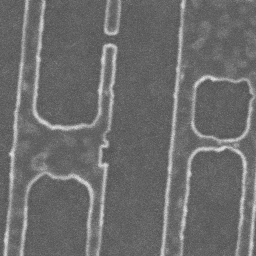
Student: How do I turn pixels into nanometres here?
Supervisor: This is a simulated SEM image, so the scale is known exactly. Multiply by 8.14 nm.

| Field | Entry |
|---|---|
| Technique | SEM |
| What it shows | one or a few lines or trenches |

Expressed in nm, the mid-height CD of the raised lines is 153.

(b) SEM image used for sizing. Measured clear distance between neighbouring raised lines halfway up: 502 nm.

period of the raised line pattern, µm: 0.635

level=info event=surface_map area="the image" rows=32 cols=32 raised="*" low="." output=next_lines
...***.......**........*********
...**........**........*********
...**........**........*********
...**........**........*********
...**.................**********
...**.................**********
...**........**.......**********
...**........*........**********
...**........*........**********
..***........*........**********
..***.......**........***......*
..***.......**........**.......*
..**........**........**.......*
..**........**........**.......*
..***.......**........**.......*
..****.....***........**.......*
..***********.........***......*
..***********........***********
..***********........***********
.************........***......**
.************........***......**
.************........***......**
.***......***........***......**
.***.......**........***......**
.**........**........***......**
.**........**........**.......**
.**........**........**.......**
.**........**........**.......**
.**........**.......***.......**
.**........**.......***.......**
.**........**.......***.......**
.**........*........***.......*.